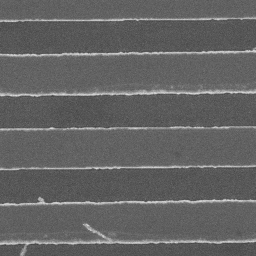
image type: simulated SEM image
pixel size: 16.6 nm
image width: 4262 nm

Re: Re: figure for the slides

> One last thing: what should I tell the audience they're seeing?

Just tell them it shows lines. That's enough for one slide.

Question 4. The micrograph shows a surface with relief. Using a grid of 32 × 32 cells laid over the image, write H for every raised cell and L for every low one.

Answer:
HHHHHHHHHHHHHHHHHHHHHHHHHHHHHHHH
HHHHHHHHHHHHHHHHHHHHHHHHHHHHHHHH
HHHHHHHHHHHHHHHHLLLLLLLLLLLLLLLL
LLLLLLLLLLLLLLLLLLLLLLLLLLLLLLLL
LLLLLLLLLLLLLLLLLLLLLLLLLLLLLLLL
LLLLLLLLLLLLLLLLLLLLLLLLLLLLLLLL
LLLLLLLLLLLLLLLLLLLLLLLLLLHHHHHH
HHHHHHHHHHHHHHHHHHHHHHHHHHHHHHHH
HHHHHHHHHHHHHHHHHHHHHHHHHHHHHHHH
HHHHHHHHHHHHHHHHHHHHHHHHHHHHHHHH
HHHHHHHHHHHHHHHHHHHHHHHHHHHHHHHH
HHHHHHHHHHHHHHHHHHHHHHHHHHHHLLHL
LLLLLLLLLLLLLLLLLLLLLLLLLLLLLLLL
LLLLLLLLLLLLLLLLLLLLLLLLLLLLLLLL
LLLLLLLLLLLLLLLLLLLLLLLLLLLLLLLL
LLLLLLLLLLLLLLLLLLLLLLLLLLLLLLLL
HHHHHHHHHHHHHHHHHHHHHHHHHHHHHHHH
HHHHHHHHHHHHHHHHHHHHHHHHHHHHHHHH
HHHHHHHHHHHHHHHHHHHHHHHHHHHHHHHH
HHHHHHHHHHHHHHHHHHHHHHHHHHHHHHHH
HHHHHHHHHHHHHHHHHHHHHHHHHHHHHHHH
LLLLLLLLLLLLLLLLLLLLLLLLLLLLLLLL
LLLLLLLLLLLLLLLLLLLLLLLLLLLLLLLL
LLLLLLLLLLLLLLLLLLLLLLLLLLLLLLLL
LLLLLLLLLLLLLLLLLLLLLLLLLLLLLLLL
HLHHHHHHHHHHHHHHHHHHHHHHHHHHHHHH
HHHHHHHHHHHHHHHHHHHHHHHHHHHHHHHH
HHHHHHHHHHHHHHHHHHHHHHHHHHHHHHHH
HHHHHHHHHHHHHHHHHHHHHHHHHHHHHHHH
HHHHHHHHHHHHHHHHHHHHHHHHHHHHHHHH
LLLLLLLLLLLLLLLLLLLLLLLLLLLLLLLL
LLLLLLLLLLLLLLLLLLLLLLLLLLLLLLLL